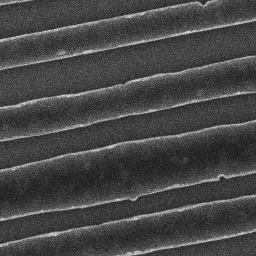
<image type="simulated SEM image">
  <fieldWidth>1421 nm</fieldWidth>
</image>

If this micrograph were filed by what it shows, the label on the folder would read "one or a few lines or trenches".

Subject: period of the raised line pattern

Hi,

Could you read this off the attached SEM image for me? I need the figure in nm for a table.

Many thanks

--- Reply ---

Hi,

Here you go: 380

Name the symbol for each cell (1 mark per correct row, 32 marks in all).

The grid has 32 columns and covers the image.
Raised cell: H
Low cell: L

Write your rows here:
HLLLLLLLLLLLLLLLLLLLLLLHHHHHHHHH
LLLLLLLLLLLLLLLLLLHHHHHHHHHHHHHH
LLLLLLLLLLLLLHHHHHHHHHHHHHHHHHHH
LLLLLLLHHHHHHHHHHHHHHHHHHHHLLLLL
LLHHHHHHHHHHHHHHHHHHHHLLLLLLLLLL
HHHHHHHHHHHHHHHHHLLLLLLLLLLLLLLL
HHHHHHHHHHHHLLLLLLLLLLLLLLLLLLLL
HHHHHHLLLLLLLLLLLLLLLLLLLLLLLHHH
HLLLLLLLLLLLLLLLLLLLLLLLHHHHHHHH
LLLLLLLLLLLLLLLLLLLHHHHHHHHHHHHH
LLLLLLLLLLLLLLLHHHHHHHHHHHHHHHHH
LLLLLLLLLLLHHHHHHHHHHHHHHHHHHHHH
LLLLHHHHHHHHHHHHHHHHHHHHHHLLLLLL
HHHHHHHHHHHHHHHHHHHHHLLLLLLLLLLL
HHHHHHHHHHHHHHHHLLLLLLLLLLLLLLLL
HHHHHHHHHHHHLLLLLLLLLLLLLLLLLLHH
HHHHHHHLLLLLLLLLLLLLLLLLHHHHHHHH
HLLLLLLLLLLLLLLLLLHHHHHHHHHHHHHH
LLLLLLLLLLLLLHHHHHHHHHHHHHHHHHHH
LLLLLLLHHHHHHHHHHHHHHHHHHHHHHHHH
LLLHHHHHHHHHHHHHHHHHHHHHHHHHHHHH
HHHHHHHHHHHHHHHHHHHHHHHHHHHHHHHH
HHHHHHHHHHHHHHHHHHHHHHHHHHHLLLLL
HHHHHHHHHHHHHHHHHHHHHHLLLLLLLLLL
HHHHHHHHHHHHHHHHHHLLLLLLLLLLLLLH
HHHHHHHHHHHHHLLLLLLLLLLLLHHHHHHH
HHHHHHLLLLLLLLLLLLLLHHHHHHHHHHHH
HLLLLLLLLLLLLLLHHHHHHHHHHHHHHHHH
LLLLLLLLLLHHHHHHHHHHHHHHHHHHHHHH
LLLLLHHHHHHHHHHHHHHHHHHHHHHHHLLL
HHHHHHHHHHHHHHHHHHHHHHHHLLLLLLLL
HHHHHHHHHHHHHHHHHHHLLLLLLLLLLLLL